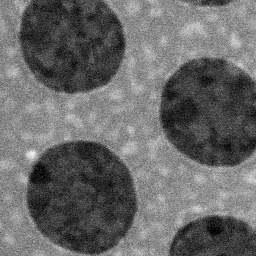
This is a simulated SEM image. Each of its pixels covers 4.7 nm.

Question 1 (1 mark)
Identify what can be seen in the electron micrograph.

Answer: raised bodies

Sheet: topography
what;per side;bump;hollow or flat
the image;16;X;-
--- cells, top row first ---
--XXXXX---------
-XXXXXXX--------
-XXXXXXX--------
-XXXXXXX--------
--XXXXX----XXXXX
---XXX----XXXXXX
----------XXXXXX
----------XXXXXX
----------XXXXXX
---XXXX----XXXXX
--XXXXXX-----XX-
--XXXXXX--------
--XXXXXXX-------
--XXXXXXX---XXX-
--XXXXXX---XXXXX
----XXX---XXXXXX